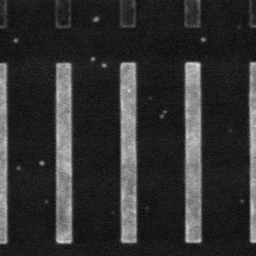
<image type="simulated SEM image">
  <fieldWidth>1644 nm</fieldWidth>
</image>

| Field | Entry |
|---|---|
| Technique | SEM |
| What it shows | wiring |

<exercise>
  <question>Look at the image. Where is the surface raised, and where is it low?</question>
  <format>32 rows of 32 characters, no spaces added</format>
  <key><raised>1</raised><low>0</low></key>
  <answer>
10000001100000011000000110000001
10000001100000011000000110000001
10000001100000011000000110000001
00000000000000000000000000000000
00000000000000000000000000000000
00000000000000000000000000000000
00000000000000000000000000000000
00000000000000000000000000000000
10000001100000011000000110000001
10000001100000011000000110000001
10000001100000011000000110000001
10000001100000011000000110000001
10000001100000011000000110000001
10000001100000011000000110000001
10000001100000011000000110000001
10000001100000011000000110000001
10000001100000011000000110000001
10000001100000011000000110000001
10000001100000011000000110000001
10000001100000011000000110000001
10000001100000011000000110000001
10000001100000011000000110000001
10000001100000011000000110000001
10000001100000011000000110000001
10000001100000011000000110000001
10000001100000011000000110000001
10000001100000011000000110000001
10000001100000011000000110000001
10000001100000011000000110000001
10000001100000011000000110000001
00000000000000000000000000000000
00000000000000000000000000000000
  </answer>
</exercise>